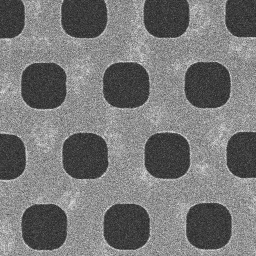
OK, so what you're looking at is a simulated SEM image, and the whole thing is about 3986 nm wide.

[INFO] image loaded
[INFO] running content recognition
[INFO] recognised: a regular array of holes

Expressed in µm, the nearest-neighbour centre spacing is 1.27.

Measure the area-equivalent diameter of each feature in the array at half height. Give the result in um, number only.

0.763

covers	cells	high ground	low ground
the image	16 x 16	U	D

DDUUDDDUUDDDUUDD
DDUUDDDUUDDDUUDD
UUUUUUUUUUUUUUUU
UUUUUUUUUUUUUUUU
UDDDUUUDDUUUDDUU
UDDDUUDDDUUUDDUU
UUDDUUUDDUUUDDUU
UUUUUUUUUUUUUUUU
DUUUDDUUUUDUUUUD
DDUUDDDUUDDDUUDD
DDUUDDDUUDDDUUDD
UUUUUUUUUUUUUUUU
UUUUUUUUUUUUUUUU
UDDDUUUDDUUUDDUU
UDDDUUDDDUUUDDUU
UUDDUUUDDUUUDDUU